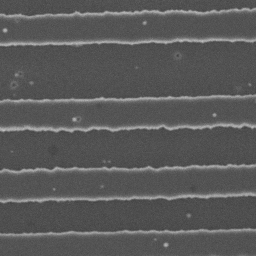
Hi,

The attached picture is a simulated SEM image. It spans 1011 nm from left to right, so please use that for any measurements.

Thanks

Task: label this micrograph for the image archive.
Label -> lines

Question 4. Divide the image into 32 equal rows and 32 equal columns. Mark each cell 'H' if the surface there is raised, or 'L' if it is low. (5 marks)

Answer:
LLLLLLLLLLLLLLLLLLLLLLLLLLLLLLLL
LLLLLLLLLLLLLLLLLHHHHHHHHLHHHHHH
HHHHHHHHHHHHHHHHHHHHHHHHHHHHHHHH
HHHHHHHHHHHHHHHHHHHHHHHHHHHHHHHH
HHHHHHHHHHHHHHHHHHHHHHHHHHHHHHHH
HHHHHHHHHLLLLLLLLLLLLLLLLLLLLLLL
LLLLLLLLLLLLLLLLLLLLLLLLLLLLLLLL
LLLLLLLLLLLLLLLLLLLLLLLLLLLLLLLL
LLLLLLLLLLLLLLLLLLLLLLLLLLLLLLLL
LLLLLLLLLLLLLLLLLLLLLLLLLLLLLLLL
LLLLLLLLLLLLLLLLLLLLLLLLLLLLLLLL
LLLLLLLLLLLLLLLLLLLLLLLLLLLLLLLL
LHHHLHHHHHHHHHHHHHHHHHHHHHHHHHHH
HHHHHHHHHHHHHHHHHHHHHHHHHHHHHHHH
HHHHHHHHHHHHHHHHHHHHHHHHHHHHHHHH
HHHHHHHHHHHHHHHHHHHHHHHHHHHHHHHH
LLLLLLLLLLLLLLLLLLLLLLLLLLLLLLLL
LLLLLLLLLLLLLLLLLLLLLLLLLLLLLLLL
LLLLLLLLLLLLLLLLLLLLLLLLLLLLLLLL
LLLLLLLLLLLLLLLLLLLLLLLLLLLLLLLL
LLLLLLLLLLLLLLLLLLLLLLLLLLLLLLLL
HHHHHHHHHHHHHHHHHHHHHHHHHHHHHHHH
HHHHHHHHHHHHHHHHHHHHHHHHHHHHHHHH
HHHHHHHHHHHHHHHHHHHHHHHHHHHHHHHH
HHHHHHHHHHHHHHHHHHHHHHHHHHHHHLLL
LLLLLLLLLLLLLLLLLLLLLLLLLLLLLLLL
LLLLLLLLLLLLLLLLLLLLLLLLLLLLLLLL
LLLLLLLLLLLLLLLLLLLLLLLLLLLLLLLL
LLLLLLLLLLLLLLLLLLLLLLLLLLLLLLLL
HHHHHHHHHHHHHHHHHHHHHHHHHHHHHHHH
HHHHHHHHHHHHHHHHHHHHHHHHHHHHHHHH
HHHHHHHHHHHHHHHHHHHHHHHHHHHHHHHH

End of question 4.